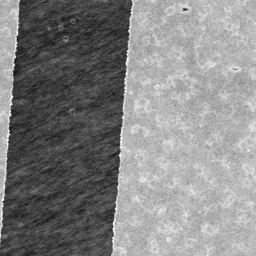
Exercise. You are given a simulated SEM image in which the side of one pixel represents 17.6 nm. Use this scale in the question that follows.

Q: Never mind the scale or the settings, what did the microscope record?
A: one or a few lines or trenches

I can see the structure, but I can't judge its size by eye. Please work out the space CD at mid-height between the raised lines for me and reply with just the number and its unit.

2000 nm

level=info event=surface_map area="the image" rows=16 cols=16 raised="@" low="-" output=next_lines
@-------@@@@@@@@
@-------@@@@@@@@
@-------@@@@@@@@
@-------@@@@@@@@
@-------@@@@@@@@
@-------@@@@@@@@
@-------@@@@@@@@
@-------@@@@@@@@
@-------@@@@@@@@
--------@@@@@@@@
--------@@@@@@@@
-------@@@@@@@@@
-------@@@@@@@@@
-------@@@@@@@@@
-------@@@@@@@@@
-------@@@@@@@@@